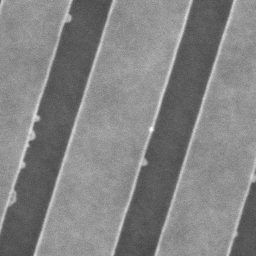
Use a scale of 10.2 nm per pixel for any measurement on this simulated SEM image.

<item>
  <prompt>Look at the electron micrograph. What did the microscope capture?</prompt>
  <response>lines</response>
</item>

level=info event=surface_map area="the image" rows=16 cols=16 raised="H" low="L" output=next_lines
HHHHLLLHHHHHLLHH
HHHHLLLHHHHHLLHH
HHHHLLHHHHHLLLHH
HHHLLLHHHHHLLLHH
HHHLLLHHHHHLLHHH
HHHLLHHHHHLLLHHH
HHLLLHHHHHLLLHHH
HHLLLHHHHHLLHHHH
HHLLHHHHHLLLHHHH
HHLLHHHHHLLLHHHH
HLLLHHHHHLLHHHHH
HLLLHHHHLLLHHHHH
HLLHHHHHLLLHHHHL
LLLHHHHHLLHHHHHL
LLLHHHHHLLHHHHHL
LLHHHHHLLLHHHHLL